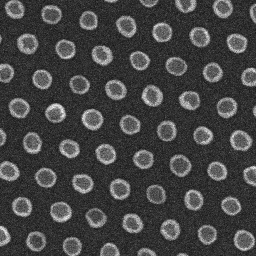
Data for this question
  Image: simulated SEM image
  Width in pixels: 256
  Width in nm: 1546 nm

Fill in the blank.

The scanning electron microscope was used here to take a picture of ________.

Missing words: a regular array of raised bodies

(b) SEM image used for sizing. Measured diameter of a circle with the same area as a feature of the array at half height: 113 nm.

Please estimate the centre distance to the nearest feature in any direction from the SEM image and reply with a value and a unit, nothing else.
222 nanometres